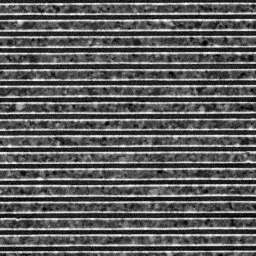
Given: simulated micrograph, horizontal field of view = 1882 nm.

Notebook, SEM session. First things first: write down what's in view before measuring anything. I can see parallel lines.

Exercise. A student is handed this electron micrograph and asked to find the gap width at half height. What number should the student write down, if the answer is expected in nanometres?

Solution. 47.8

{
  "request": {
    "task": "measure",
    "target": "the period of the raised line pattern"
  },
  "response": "122 nm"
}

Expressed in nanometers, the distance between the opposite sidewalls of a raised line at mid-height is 76.3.